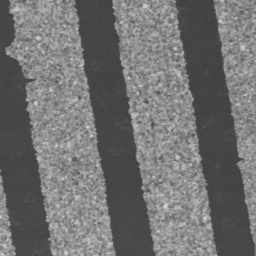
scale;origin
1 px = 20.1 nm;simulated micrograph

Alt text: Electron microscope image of one or a few lines or trenches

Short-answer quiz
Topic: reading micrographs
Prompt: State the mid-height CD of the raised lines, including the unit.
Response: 1230 nanometres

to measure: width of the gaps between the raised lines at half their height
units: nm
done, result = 776